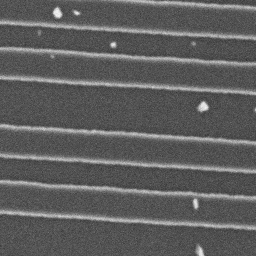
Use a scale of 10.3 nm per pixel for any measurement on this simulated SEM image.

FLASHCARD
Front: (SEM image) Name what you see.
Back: lines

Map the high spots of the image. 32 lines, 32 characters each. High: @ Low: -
@@@@@@@@@@@@@@@@@@@@@@@@@@------
@@@@@@@@@@@@@@@@@@@@@@@@@@@@@@@@
@@@@@@@@@@@@@@@@@@@@@@@@@@@@@@@@
---------@@@@@@@@@@@@@@@@@@@@@@@
--------------------------@@@@@@
--------------------------------
@@@@@@@@@@----------------------
@@@@@@@@@@@@@@@@@@@@@@@@@-------
@@@@@@@@@@@@@@@@@@@@@@@@@@@@@@@@
@@@@@@@@@@@@@@@@@@@@@@@@@@@@@@@@
----------@@@@@@@@@@@@@@@@@@@@@@
---------------------------@@@@@
--------------------------------
-------------------------@------
--------------------------------
--------------------------------
@@@@@@@@@@@@@-------------------
@@@@@@@@@@@@@@@@@@@@@@@@@@@@@---
@@@@@@@@@@@@@@@@@@@@@@@@@@@@@@@@
@@@@@@@@@@@@@@@@@@@@@@@@@@@@@@@@
---------------@@@@@@@@@@@@@@@@@
------------------------------@@
--------------------------------
@@@@@@@@@@@@@@------------------
@@@@@@@@@@@@@@@@@@@@@@@@@@@@@---
@@@@@@@@@@@@@@@@@@@@@@@@@@@@@@@@
@@@@@@@@@@@@@@@@@@@@@@@@@@@@@@@@
-------------@@@@@@@@@@@@@@@@@@@
------------------------------@@
--------------------------------
--------------------------------
--------------------------------